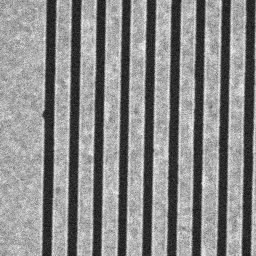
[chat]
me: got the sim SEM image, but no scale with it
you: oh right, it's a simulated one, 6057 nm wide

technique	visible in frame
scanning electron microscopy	parallel lines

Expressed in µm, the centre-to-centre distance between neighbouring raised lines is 0.589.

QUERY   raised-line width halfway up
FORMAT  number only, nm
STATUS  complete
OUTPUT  302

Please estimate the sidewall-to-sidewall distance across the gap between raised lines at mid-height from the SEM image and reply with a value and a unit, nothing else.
0.281 um